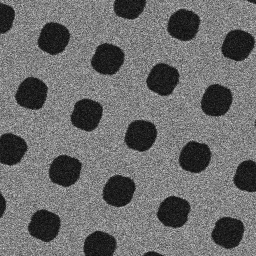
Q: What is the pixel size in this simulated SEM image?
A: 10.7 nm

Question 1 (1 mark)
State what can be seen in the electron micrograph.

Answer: a regular array of holes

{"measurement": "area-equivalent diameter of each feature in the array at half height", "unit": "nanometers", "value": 343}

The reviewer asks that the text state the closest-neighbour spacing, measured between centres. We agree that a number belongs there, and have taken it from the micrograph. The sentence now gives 616 nm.